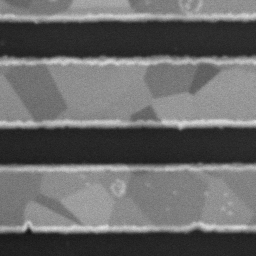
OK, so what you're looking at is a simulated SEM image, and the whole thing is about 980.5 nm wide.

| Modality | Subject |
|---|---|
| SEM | one or a few lines or trenches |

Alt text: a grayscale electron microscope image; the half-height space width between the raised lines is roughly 0.17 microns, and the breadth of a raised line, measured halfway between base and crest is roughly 235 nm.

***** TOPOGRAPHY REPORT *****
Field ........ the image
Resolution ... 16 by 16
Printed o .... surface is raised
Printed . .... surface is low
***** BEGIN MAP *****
oooooooooooooooo
................
................
................
oooooooooooooooo
oooooooooooooooo
oooooooooooooooo
oooooooooooooooo
................
................
......o....ooo.o
oooooooooooooooo
oooooooooooooooo
oooooooooooooooo
................
................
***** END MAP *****